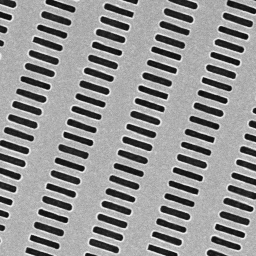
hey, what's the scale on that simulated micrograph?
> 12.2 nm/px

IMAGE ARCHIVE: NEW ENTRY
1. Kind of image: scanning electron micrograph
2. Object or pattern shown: a regular array of holes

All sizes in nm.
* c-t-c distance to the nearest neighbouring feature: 164